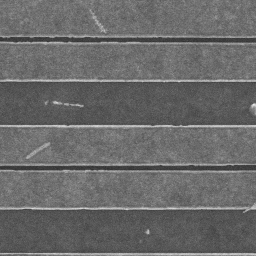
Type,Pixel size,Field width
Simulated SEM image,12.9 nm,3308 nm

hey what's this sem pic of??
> lines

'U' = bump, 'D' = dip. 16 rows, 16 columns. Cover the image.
UUUUUUUUUUUUUUUU
UUUUUUUUUUUUUUUU
UUUUUUUUUUUUUUUU
UUUUUUUUUUUUUUUU
UUUUUUUUUUUUUUUU
DDDDDDDDDDDDDDDD
DDDDDDDDDDDDDDDD
DDDDDDDDDDDDDDDD
UUUUUUUUUUUUUUUU
UUUUUUUUUUUUUUUU
UUUUUUUUUUUUUUUU
UUUUUUUUUUUUUUUU
UUUUUUUUUUUUUUUU
DDDDDDDDDDDDDDDD
DDDDDDDDDDDDDDDD
DDDDDDDDDDDDDDDD